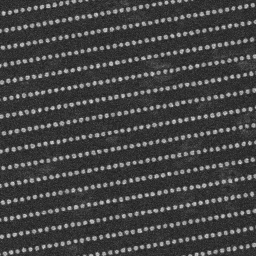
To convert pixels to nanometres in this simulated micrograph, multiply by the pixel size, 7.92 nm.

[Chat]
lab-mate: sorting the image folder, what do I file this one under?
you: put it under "a regular array of raised bodies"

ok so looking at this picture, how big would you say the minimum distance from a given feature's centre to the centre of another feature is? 50.2 nanometers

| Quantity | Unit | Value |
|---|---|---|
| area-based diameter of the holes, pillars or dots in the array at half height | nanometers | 29.6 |